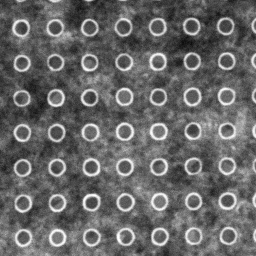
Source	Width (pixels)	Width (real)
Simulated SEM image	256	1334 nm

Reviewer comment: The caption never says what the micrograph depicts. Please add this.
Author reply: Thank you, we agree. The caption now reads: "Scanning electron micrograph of a regular array of raised bodies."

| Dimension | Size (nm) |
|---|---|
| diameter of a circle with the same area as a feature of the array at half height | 82.7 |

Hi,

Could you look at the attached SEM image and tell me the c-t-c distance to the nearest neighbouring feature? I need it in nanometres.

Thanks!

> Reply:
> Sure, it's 177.